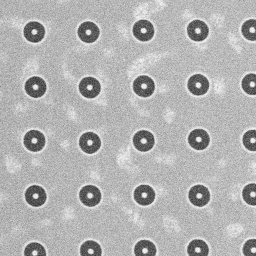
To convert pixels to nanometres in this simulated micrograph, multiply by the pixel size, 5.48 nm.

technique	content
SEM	a regular array of ring-shaped grooves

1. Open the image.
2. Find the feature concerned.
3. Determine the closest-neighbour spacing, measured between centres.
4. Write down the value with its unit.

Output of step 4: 295 nm